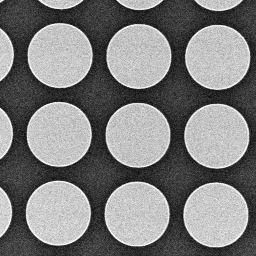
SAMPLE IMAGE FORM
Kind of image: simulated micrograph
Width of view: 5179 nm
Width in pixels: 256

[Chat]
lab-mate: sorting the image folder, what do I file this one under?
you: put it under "an array of small figures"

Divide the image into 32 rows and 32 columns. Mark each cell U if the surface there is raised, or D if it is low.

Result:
DDDDDDUUUUDDDDDUUUUUDDDDDUUUUUDD
DDDDDDDDDDDDDDDDDDDDDDDDDDDDDDDD
DDDDDDDDDDDDDDDDDDDDDDDDDDDDDDDD
DDDDDUUUUUDDDDDUUUUDDDDDDDUUUDDD
UDDDUUUUUUUDDDUUUUUUDDDDUUUUUUDD
UDDDUUUUUUUDDDUUUUUUUDDDUUUUUUUD
UUDDUUUUUUUUDUUUUUUUUDDUUUUUUUUD
UUDDUUUUUUUDDUUUUUUUUDDUUUUUUUUD
UDDDUUUUUUUDDDUUUUUUUDDUUUUUUUUD
UDDDUUUUUUUDDDUUUUUUUDDDUUUUUUDD
DDDDDDUUUDDDDDDUUUUDDDDDDUUUUDDD
DDDDDDDDDDDDDDDDDDDDDDDDDDDDDDDD
DDDDDDDDDDDDDDDDDDDDDDDDDDDDDDDD
DDDDDUUUUUDDDDDUUUUDDDDDDUUUUDDD
UDDDUUUUUUUDDDUUUUUUDDDDUUUUUUDD
UDDDUUUUUUUDDUUUUUUUUDDUUUUUUUUD
UUDUUUUUUUUDDUUUUUUUUDDUUUUUUUUD
UDDUUUUUUUUDDUUUUUUUUDDUUUUUUUUD
UDDDUUUUUUUDDDUUUUUUUDDUUUUUUUUD
DDDDUUUUUUDDDDUUUUUUDDDDUUUUUUDD
DDDDDDUUUDDDDDDUUUUDDDDDDUUUUDDD
DDDDDDDDDDDDDDDDDDDDDDDDDDDDDDDD
DDDDDDDDDDDDDDDDDDDDDDDDDDDDDDDD
DDDDDUUUUUDDDDDUUUUDDDDDDUUUUDDD
UDDDUUUUUUUDDDUUUUUUDDDDUUUUUUDD
UDDUUUUUUUUDDUUUUUUUUDDUUUUUUUUD
UDDUUUUUUUUDDUUUUUUUUDDUUUUUUUUD
UDDUUUUUUUUDDUUUUUUUUDDUUUUUUUUD
UDDDUUUUUUUDDUUUUUUUUDDUUUUUUUUD
DDDDUUUUUUDDDDUUUUUUDDDDUUUUUUDD
DDDDDDUUUDDDDDDDUUUDDDDDDUUUUDDD
DDDDDDDDDDDDDDDDDDDDDDDDDDDDDDDD